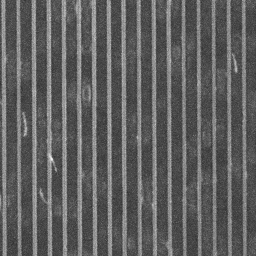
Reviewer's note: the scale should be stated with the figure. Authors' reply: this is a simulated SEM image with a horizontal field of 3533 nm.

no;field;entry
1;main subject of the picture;parallel lines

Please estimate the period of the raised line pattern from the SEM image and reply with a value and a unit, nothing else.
15 pixels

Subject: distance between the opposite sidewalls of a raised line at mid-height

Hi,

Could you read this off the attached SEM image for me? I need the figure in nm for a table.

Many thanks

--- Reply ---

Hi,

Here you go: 41.4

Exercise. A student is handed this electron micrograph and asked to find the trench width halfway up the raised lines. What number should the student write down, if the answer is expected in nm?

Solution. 166